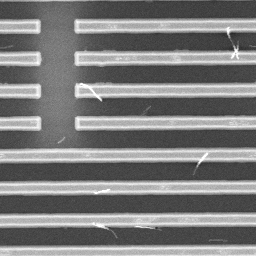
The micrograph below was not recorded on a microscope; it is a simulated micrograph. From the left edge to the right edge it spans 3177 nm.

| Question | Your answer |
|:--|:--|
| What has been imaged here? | parallel lines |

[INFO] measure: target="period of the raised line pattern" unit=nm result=401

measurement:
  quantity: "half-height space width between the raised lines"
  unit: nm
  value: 253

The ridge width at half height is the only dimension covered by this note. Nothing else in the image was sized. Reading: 0.149 microns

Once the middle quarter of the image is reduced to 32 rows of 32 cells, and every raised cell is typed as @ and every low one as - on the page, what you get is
--------------------------------
--------------------------------
--------------------------------
--------------------------------
--------------------------------
---@@@@@@@@@@@@@@@@@@@@@@@@@@@@@
---@@@@@@@@@@@@@@@@@@@@@@@@@@@@@
---@@@@@@@@@@@@@@@@@@@@@@@@@@@@@
--------@-----------------------
--------------------------------
--------------------------------
--------------------------------
--------------------------------
---@@@@@@@@@@@@@@@@@@@@@@@@@@@@@
---@@@@@@@@@@@@@@@@@@@@@@@@@@@@@
---@@@@@@@@@@@@@@@@@@@@@@@@@@@@@
--------------------------------
--------------------------------
--------------------------------
--------------------------------
--------------------------------
--------------@@@@@@@@@@@@@@@@@@
@@@@@@@@@@@@@@@@@@@@@@@@@@@@@@@@
@@@@@@@@@@@@@@@@@@@@@@@@@@@@@@@@
--------------------------------
--------------------------------
--------------------------------
--------------------------------
--------------------------------
--------------------------------
@@@@@@@@@@@@@@@@@@@@@@@@@@@@@@@@
@@@@@@@@@@@@@@@@@@@@@@@@@@@@@@@@